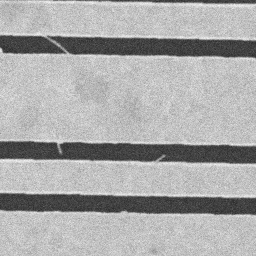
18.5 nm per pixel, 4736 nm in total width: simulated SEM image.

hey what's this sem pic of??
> lines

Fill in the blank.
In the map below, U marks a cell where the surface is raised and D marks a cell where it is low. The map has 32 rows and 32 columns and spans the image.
UUUUUUUUUUUUUUDDDDDDDDDDDDDDDDDD
UUUUUUUUUUUUUUUUUUUUUUUUUUUUUUUU
UUUUUUUUUUUUUUUUUUUUUUUUUUUUUUUU
UUUUUUUUUUUUUUUUUUUUUUUUUUUUUUUU
DDDDDDDDDDDUUUUUUUUUUUUUUUUUUUUU
DDDDDDDDDDDDDDDDDDDDDDDDDDDDDDDD
DDDDDDDDDDDDDDDDDDDDDDDDDDDDDDDD
UUUUUUUUUUUUUUUUUUUUUUUUUUUUUUUU
UUUUUUUUUUUUUUUUUUUUUUUUUUUUUUUU
UUUUUUUUUUUUUUUUUUUUUUUUUUUUUUUU
UUUUUUUUUUUUUUUUUUUUUUUUUUUUUUUU
UUUUUUUUUUUUUUUUUUUUUUUUUUUUUUUU
UUUUUUUUUUUUUUUUUUUUUUUUUUUUUUUU
UUUUUUUUUUUUUUUUUUUUUUUUUUUUUUUU
UUUUUUUUUUUUUUUUUUUUUUUUUUUUUUUU
UUUUUUUUUUUUUUUUUUUUUUUUUUUUUUUU
UUUUUUUUUUUUUUUUUUUUUUUUUUUUUUUU
UUUUUUUUUUUUUUUUUUUUUUUUUUUUUUUU
DDDDDDDDDDDDDDDDDDDDDDDDDDDDDDDD
DDDDDDDDDDDDDDDDDDDDDDDDDDDDDDDD
UUUUUUUUUUUUUUUUUUUUUDDDDDDDDDDD
UUUUUUUUUUUUUUUUUUUUUUUUUUUUUUUU
UUUUUUUUUUUUUUUUUUUUUUUUUUUUUUUU
UUUUUUUUUUUUUUUUUUUUUUUUUUUUUUUU
DDDDDDDDDDDDDDDDDDDDDDDDDDUUUUUU
DDDDDDDDDDDDDDDDDDDDDDDDDDDDDDDD
UUUUDDDDDDDDDDDUDDDDDDDDDDDDDDDD
UUUUUUUUUUUUUUUUUUUUUUUUUUUUUUUU
UUUUUUUUUUUUUUUUUUUUUUUUUUUUUUUU
UUUUUUUUUUUUUUUUUUUUUUUUUUUUUUUU
UUUUUUUUUUUUUUUUUUUUUUUUUUUUUUUU
UUUUUUUUUUUUUUUUUUUUUUUUUUUUUUUU